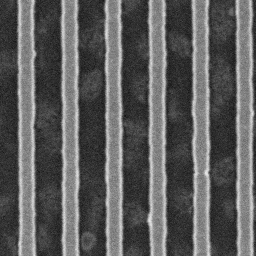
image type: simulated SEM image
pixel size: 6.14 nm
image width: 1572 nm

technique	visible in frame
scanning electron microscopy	parallel lines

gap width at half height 177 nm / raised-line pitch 0.268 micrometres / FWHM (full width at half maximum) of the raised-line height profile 89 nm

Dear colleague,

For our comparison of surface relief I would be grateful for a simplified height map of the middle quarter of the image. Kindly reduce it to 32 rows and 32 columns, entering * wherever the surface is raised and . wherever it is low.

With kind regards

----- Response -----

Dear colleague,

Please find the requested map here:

***.......****.......****.......
***.......****.......****.......
***........***.......****.......
***........***........***.......
***........***........***.......
***........***........***.......
***........***........***.......
***........***........***.......
***........***........***.......
***........***........***.......
***........***........***.......
***........***........***.......
***.......****........***.......
***.......****........***.......
***........***........***.......
***........***........***.......
***........***........***.......
***........***........***.......
***........***........***.......
***........***........***.......
***........***........***.......
***........***........***.......
***........***........***.......
***........***........***.......
***........***........***.......
***........***........***.......
****.......***........***.......
****.......***........***.......
***........***........***.......
****.......***........***.......
****.......***........***.......
***........***........***.......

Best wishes